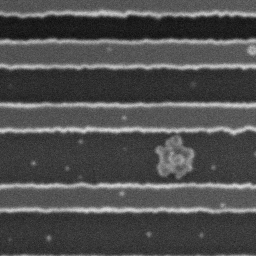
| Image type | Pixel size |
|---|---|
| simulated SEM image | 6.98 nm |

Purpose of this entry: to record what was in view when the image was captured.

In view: lines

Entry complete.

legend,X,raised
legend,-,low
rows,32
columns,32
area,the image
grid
XXXXXXXXXXXXXXXXXXXXXXXXXXXXXXXX
XXXXXXXXXXXXXXXXXXXXXXXXXXXXXXXX
--------------------------------
--------------------------------
--------------------------------
XXXXXXXXXXXXXXXXXXXXXXXXXXXXXXXX
XXXXXXXXXXXXXXXXXXXXXXXXXXXXXXXX
XXXXXXXXXXXXXXXXXXXXXXXXXXXXXXXX
-XXXXX---X-X--XXX-XX-XXXX-X---X-
--------------------------------
--------------------------------
--------------------------------
--------------------------------
XXXXXXXXXXXXXXXXXXXXXXXXXXXXXXXX
XXXXXXXXXXXXXXXXXXXXXXXXXXXXXXXX
XXXXXXXXXXXXXXXXXXXXXXXXXXXXXXXX
-----------------------------X--
--------------------------------
--------------------------------
--------------------------------
--------------------------------
--------------------------------
--------------------------------
XXXXXXXXXXXXXXXXXXXXXXXXXXXXXXXX
XXXXXXXXXXXXXXXXXXXXXXXXXXXXXXXX
XXXXXXXXXXXXXXXXXXXXXXXXXXXXXXXX
--------------------------------
--------------------------------
--------------------------------
--------------------------------
--------------------------------
--------------------------------